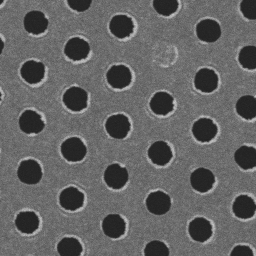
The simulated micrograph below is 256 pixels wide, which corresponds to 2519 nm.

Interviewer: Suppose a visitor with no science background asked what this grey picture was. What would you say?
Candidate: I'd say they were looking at a regular array of holes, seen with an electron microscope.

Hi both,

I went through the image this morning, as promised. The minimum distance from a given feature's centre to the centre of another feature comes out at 488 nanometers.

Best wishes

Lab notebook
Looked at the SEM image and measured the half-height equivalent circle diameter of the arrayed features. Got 239 nanometers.